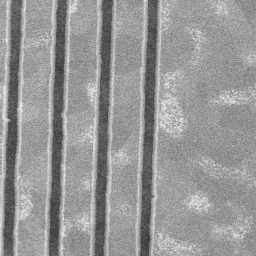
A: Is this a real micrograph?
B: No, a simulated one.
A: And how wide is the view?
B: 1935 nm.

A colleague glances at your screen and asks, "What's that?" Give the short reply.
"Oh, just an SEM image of parallel lines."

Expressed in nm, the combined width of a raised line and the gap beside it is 344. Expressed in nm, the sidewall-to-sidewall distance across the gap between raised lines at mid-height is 105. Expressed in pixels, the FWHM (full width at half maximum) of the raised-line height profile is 32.